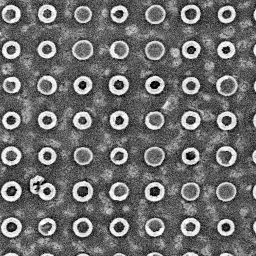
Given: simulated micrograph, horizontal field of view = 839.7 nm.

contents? a regular array of raised bodies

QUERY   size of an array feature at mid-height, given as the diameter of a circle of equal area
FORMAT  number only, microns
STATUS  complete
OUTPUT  0.0587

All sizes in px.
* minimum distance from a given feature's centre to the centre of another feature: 35.2